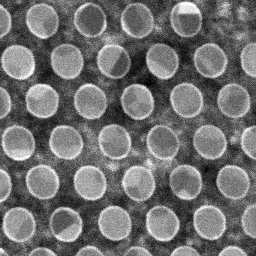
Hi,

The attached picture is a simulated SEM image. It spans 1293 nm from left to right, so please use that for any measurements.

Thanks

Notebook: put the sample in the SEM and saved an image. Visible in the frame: a regular array of raised bodies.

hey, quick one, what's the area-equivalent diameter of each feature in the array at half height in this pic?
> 0.165 um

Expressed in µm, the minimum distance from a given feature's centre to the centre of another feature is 0.234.